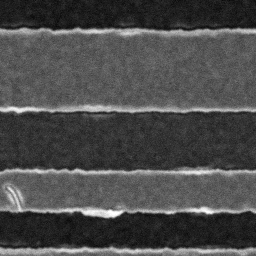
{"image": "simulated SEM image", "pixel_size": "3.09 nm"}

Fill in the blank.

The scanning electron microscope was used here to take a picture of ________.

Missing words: lines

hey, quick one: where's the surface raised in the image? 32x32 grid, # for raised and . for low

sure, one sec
................................
................................
................................
................................
################################
################################
################################
################################
################################
################################
################################
################################
################################
################################
................................
................................
................................
................................
................................
................................
................................
################################
################################
################################
################################
################################
.....####.#######.####..######..
................................
................................
................................
................................
################################